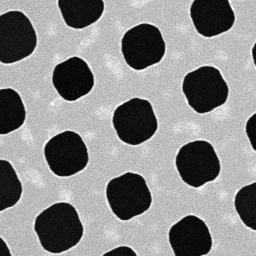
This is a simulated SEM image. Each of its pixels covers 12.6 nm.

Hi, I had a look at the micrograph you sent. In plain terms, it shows a regular array of holes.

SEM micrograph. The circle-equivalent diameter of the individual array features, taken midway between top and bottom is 572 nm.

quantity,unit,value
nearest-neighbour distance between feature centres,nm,943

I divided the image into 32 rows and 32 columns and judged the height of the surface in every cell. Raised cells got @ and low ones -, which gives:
@@@@@@@------@@@@@@@@@@@-----@@@
@--@@@@@-----@@@@@@@@@@@-----@@@
----@@@@----@@@@@@@@@@@@-----@@@
----@@@@@-@@@@@@----@@@@-----@@@
-----@@@@@@@@@@-----@@@@@@-@@@@@
-----@@@@@@@@@@------@@@@@@@@@@@
----@@@@@@@@@@@------@@@@@@@@@@-
---@@@@@--@@@@@@----@@@@@@@@@@@@
@@@@@@@----@@@@@@-@@@@@@@--@@@@@
@@@@@@@-----@@@@@@@@@@@-----@@@@
@@@@@@@-----@@@@@@@@@@@-----@@@@
--@@@@@----@@@@@@@@@@@@------@@@
---@@@@@-@@@@@@@--@@@@@-----@@@@
---@@@@@@@@@@@@----@@@@@---@@@@@
---@@@@@@@@@@@-----@@@@@@@@@@@@-
---@@@@@@@@@@@------@@@@@@@@@@@-
-@@@@@@@-@@@@@@----@@@@@@@@@@@@-
@@@@@@----@@@@@---@@@@@@@@@@@@@-
@@@@@@-----@@@@@@@@@@@@----@@@@@
@@@@@@-----@@@@@@@@@@@-----@@@@@
-@@@@@-----@@@@@@@@@@@------@@@@
--@@@@@---@@@@@@@@@@@@-----@@@@@
--@@@@@@@@@@@@----@@@@@----@@@@@
---@@@@@@@@@@------@@@@@@@@@@@--
---@@@@@@@@@@------@@@@@@@@@@---
--@@@@@--@@@@@-----@@@@@@@@@@---
@@@@@-----@@@@----@@@@@@@@@@@@--
@@@@------@@@@@-@@@@@@---@@@@@--
@@@@------@@@@@@@@@@@-----@@@@@-
@@@@@-----@@@@@@@@@@@-----@@@@@@
-@@@@-----@@@@@@@@@@@-----@@@@@@
-@@@@@--@@@@@----@@@@@----@@@@@@